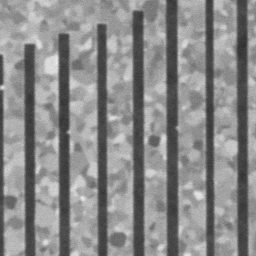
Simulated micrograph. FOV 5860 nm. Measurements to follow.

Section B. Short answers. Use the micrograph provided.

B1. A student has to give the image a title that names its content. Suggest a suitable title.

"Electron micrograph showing parallel lines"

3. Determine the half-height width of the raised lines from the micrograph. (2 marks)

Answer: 0.515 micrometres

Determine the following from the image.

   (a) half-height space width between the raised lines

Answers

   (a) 275 nanometres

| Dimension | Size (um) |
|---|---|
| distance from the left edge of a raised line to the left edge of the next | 0.806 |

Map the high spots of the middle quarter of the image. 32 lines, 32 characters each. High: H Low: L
LLHHHHHHLLLHHHHHHLLLHHHHHLLLLHHH
LLHHHHHHLLLHHHHHHLLLHHHHHLLLLHHH
LLHHHHHHLLLHHHHHHLLLHHHHHLLLLHHH
LLHHHHHHLLLHHHHHHLLLHHHHHLLLLHHH
LLHHHHHHLLLHHHHHHLLLHHHHHLLLLHHH
LLHHHHHHLLLHHHHHHLLLHHHHHLLLLHHH
LLHHHHHHLLLHHHHHHLLLHHHHHLLLLHHH
LLHHHHHHLLLHHHHHHLLLHHHHHLLLLHHH
LLHHHHHHLLLHHHHHHLLLHHHHHLLLLHHH
LLHHHHHHLLLHHHHHHLLLHHHHHLLLLHHH
LLHHHHHHLLLHHHHHHLLLHHHHHLLLLHHH
LLHHHHHHLLLHHHHHHLLLHHHHHLLLLHHH
LLHHHHHHLLLHHHHHHLLLHHHHHLLLLHHH
LLHHHHHHLLLHHHHHHLLLHHHHHLLLLHHH
LLHHHHHHLLLHHHHHHLLLHHHHHLLLLHHH
LLHHHHHHLLLHHHHHHLLLHHHHHLLLLHHH
LHHHHHHHLLLHHHHHHLLLHHHHHLLLLHHH
LHHHHHHHLLLHHHHHHLLLHHHHHLLLLHHH
LLHHHHHHLLLHHHHHHLLLHHHHHLLLLHHH
LLHHHHHHLLLHHHHHHLLLHHHHHLLLLHHH
LLHHHHHHLLLHHHHHHLLLHHHHHLLLLHHH
LLHHHHHHLLLHHHHHHLLLHHHHHLLLLHHH
LLHHHHHHLLLHHHHHHLLLHHHHHLLLLHHH
LLHHHHHHLLLHHHHHHLLLHHHHHLLLLHHH
LLHHHHHHLLLHHHHHHLLLHHHHHLLLLHHH
LLHHHHHHLLLHHHHHHLLLHHHHHLLLLHHH
LLHHHHHHLLLHHHHHHLLLHHHHHLLLLHHH
LLHHHHHHLLLHHHHHHLLLHHHHHLLLLHHH
LLHHHHHHLLLHHHHHHLLLHHHHHLLLLHHH
LLHHHHHHLLLHHHHHHLLLHHHHHLLLLHHH
LLHHHHHHLLLHHHHHHLLLHHHHHLLLLHHH
LLHHHHHHLLLHHHHHHLLLHHHHHLLLLHHH